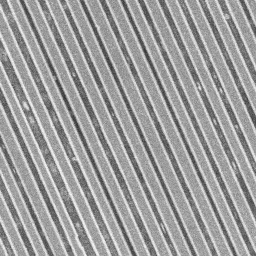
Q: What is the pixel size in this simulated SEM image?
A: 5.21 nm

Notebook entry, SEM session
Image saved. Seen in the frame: parallel lines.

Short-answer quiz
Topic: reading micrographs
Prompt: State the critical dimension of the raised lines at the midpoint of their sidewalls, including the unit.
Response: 57.2 nm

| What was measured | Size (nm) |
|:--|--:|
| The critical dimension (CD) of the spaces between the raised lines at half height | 36.3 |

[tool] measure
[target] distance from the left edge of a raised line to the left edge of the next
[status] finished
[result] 96 nanometres